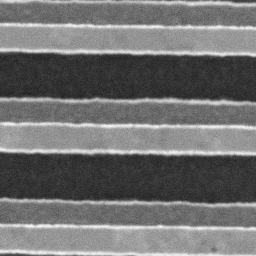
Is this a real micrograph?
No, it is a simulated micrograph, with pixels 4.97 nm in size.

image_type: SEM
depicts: lines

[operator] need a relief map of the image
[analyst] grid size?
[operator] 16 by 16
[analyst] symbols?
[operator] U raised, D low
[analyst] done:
UUUUUUUUUUUUUUUU
UUUUUUUUUUUUUUUU
UUUUUUUUUUUUUUUU
DDDDDDDDDDDDDDDD
DDDDDDDDDDDDDDDD
DDDDDDDDDDDDDDDD
UUUUUUUUUUUUUUUU
UUUUUUUUUUUUUUUU
UUUUUUUUUUUUUUUU
DUUUUUUUUUUUUUUU
DDDDDDDDDDDDDDDD
DDDDDDDDDDDDDDDD
UUUDDDDDDDDDDDDD
UUUUUUUUUUUUUUUU
UUUUUUUUUUUUUUUU
UUUUUUUUUUUUUUUU